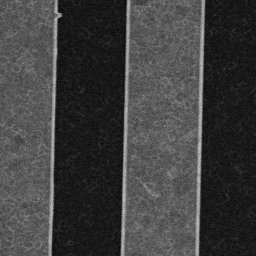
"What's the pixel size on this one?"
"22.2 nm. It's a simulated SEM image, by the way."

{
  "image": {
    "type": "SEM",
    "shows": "one or a few lines or trenches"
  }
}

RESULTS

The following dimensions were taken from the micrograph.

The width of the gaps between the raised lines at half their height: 1590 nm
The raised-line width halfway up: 1670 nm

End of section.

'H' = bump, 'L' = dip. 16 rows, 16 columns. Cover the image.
HHHHLLLLHHHHHLLL
HHHHLLLLHHHHHLLL
HHHLLLLLHHHHHLLL
HHHLLLLLHHHHHLLL
HHHLLLLLHHHHHLLL
HHHLLLLLHHHHHLLL
HHHLLLLLHHHHHLLL
HHHLLLLLHHHHHLLL
HHHLLLLLHHHHLLLL
HHHLLLLLHHHHLLLL
HHHLLLLLHHHHLLLL
HHHLLLLLHHHHLLLL
HHHLLLLLHHHHLLLL
HHHLLLLLHHHHLLLL
HHHLLLLLHHHHLLLL
HHHLLLLLHHHHLLLL